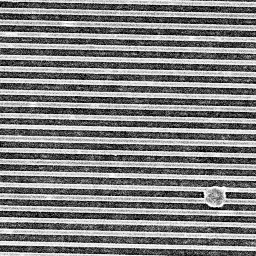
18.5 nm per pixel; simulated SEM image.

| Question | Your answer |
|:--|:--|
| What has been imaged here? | parallel lines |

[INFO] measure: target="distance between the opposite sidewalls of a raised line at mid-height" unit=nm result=78.8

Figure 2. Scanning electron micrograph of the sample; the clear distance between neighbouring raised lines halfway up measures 127 nanometres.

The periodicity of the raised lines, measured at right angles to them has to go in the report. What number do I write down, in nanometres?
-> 215